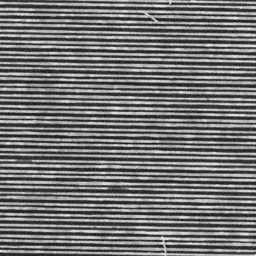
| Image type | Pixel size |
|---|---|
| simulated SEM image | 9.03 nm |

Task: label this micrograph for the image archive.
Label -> parallel lines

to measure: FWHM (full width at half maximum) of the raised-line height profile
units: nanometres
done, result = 20.3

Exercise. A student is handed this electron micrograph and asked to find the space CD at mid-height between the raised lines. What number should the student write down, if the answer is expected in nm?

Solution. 28.2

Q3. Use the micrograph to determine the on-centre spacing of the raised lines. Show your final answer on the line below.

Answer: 5.39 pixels